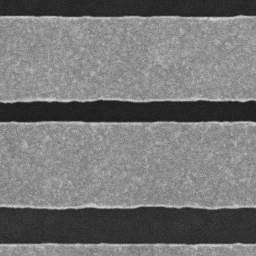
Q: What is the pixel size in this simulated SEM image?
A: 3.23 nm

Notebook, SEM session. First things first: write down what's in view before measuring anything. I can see lines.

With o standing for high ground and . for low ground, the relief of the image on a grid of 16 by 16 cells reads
................
oooooooooooooooo
oooooooooooooooo
oooooooooooooooo
oooooooooooooooo
oooooooooooooooo
................
................
oooooooooooooooo
oooooooooooooooo
oooooooooooooooo
oooooooooooooooo
oooooooooooooooo
................
................
oooooooooooooooo